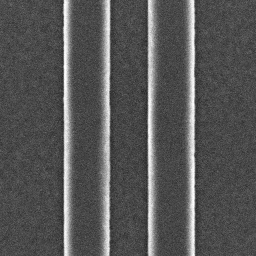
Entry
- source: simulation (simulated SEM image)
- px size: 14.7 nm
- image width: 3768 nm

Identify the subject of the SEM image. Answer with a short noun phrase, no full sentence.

lines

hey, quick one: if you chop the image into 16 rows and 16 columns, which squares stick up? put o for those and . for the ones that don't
....ooo..ooo....
....ooo..ooo....
....ooo..ooo....
....ooo..ooo....
....ooo..ooo....
....ooo..ooo....
....ooo..ooo....
....ooo..ooo....
....ooo..ooo....
....ooo..ooo....
....ooo..ooo....
....ooo..ooo....
....ooo..ooo....
....ooo..ooo....
....ooo..ooo....
....ooo..ooo....